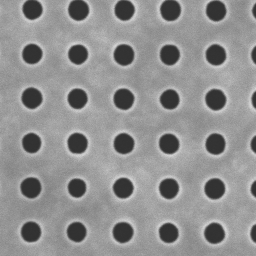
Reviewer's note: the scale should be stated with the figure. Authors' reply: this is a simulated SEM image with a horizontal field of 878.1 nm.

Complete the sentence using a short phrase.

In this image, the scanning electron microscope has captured a regular array of holes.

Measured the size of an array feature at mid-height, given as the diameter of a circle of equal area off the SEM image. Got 0.0705 µm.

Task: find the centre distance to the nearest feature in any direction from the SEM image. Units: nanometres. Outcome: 152